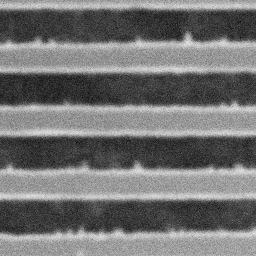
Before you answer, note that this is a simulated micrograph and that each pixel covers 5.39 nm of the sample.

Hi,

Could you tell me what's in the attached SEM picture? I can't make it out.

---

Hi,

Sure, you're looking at lines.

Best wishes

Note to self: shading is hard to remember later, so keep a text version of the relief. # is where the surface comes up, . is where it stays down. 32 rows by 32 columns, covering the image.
################################
................................
................................
................................
................................
....#.##......#.################
################################
################################
################################
................................
................................
................................
................................
#################.#..###..#.....
################################
################################
################################
................................
................................
................................
................................
################################
################################
################################
################################
................................
................................
................................
................................
#......#.#######################
################################
################################